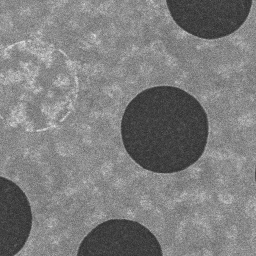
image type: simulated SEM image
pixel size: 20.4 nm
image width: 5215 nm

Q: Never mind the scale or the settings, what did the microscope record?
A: holes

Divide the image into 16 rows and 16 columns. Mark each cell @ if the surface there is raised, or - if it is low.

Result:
@@@@@@@@@@@-----
@@@@@@@@@@@----@
@@@@@@@@@@@@@@@@
@@@@@@@@@@@@@@@@
@@@@@@@@@@@@@@@@
@@@@@@@@@--@@@@@
@@@@@@@@-----@@@
@@@@@@@@-----@@@
@@@@@@@@-----@@@
@@@@@@@@-----@@@
@@@@@@@@@---@@@@
-@@@@@@@@@@@@@@@
--@@@@@@@@@@@@@@
--@@@@@@@@@@@@@@
--@@@@---@@@@@@@
-@@@@-----@@@@@@